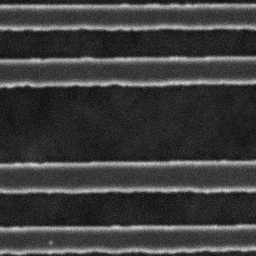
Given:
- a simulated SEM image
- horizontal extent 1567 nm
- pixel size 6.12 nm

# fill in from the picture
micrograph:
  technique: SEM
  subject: lines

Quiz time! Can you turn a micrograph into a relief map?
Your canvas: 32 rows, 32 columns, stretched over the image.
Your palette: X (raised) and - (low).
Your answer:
--------------------------------
XXXXXXXXXXXXXXXXXXXXXXXXXXXXXXXX
XXXXXXXXXXXXXXXXXXXXXXXXXXXXXXXX
XXXXXXXXXX-XXXXXXXXX-XXXXXX-XX-X
--------------------------------
--------------------------------
--------------------------------
---XXXXXXXXXXXXXXXXXXXXXXXXXXXXX
XXXXXXXXXXXXXXXXXXXXXXXXXXXXXXXX
XXXXXXXXXXXXXXXXXXXXXXXXXXXXXXXX
XXXXXXXXXXXXXXXXXXXXXXXX-----X--
--------------------------------
--------------------------------
--------------------------------
--------------------------------
--------------------------------
--------------------------------
--------------------------------
--------------------------------
--------------------------------
-XXXXXXXXXXXXXXXXXXXXXXXXXXXXXXX
XXXXXXXXXXXXXXXXXXXXXXXXXXXXXXXX
XXXXXXXXXXXXXXXXXXXXXXXXXXXXXXXX
XXXXXXXXXXXXXXXXXXXXXXXXXXXXXXXX
--------------------------------
--------------------------------
--------------------------------
--------------------------------
XXXXXXXXXXXXXXXXXXXXXXXXXXXXXXXX
XXXXXXXXXXXXXXXXXXXXXXXXXXXXXXXX
XXXXXXXXXXXXXXXXXXXXXXXXXXXXXXXX
XXXXXXXXXXX--XXX--XXXX----------